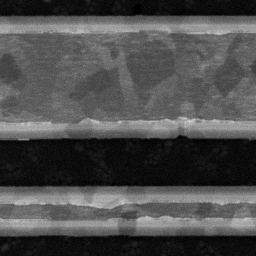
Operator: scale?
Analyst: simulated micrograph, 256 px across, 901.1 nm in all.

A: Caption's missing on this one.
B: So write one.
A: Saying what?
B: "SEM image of one or a few lines or trenches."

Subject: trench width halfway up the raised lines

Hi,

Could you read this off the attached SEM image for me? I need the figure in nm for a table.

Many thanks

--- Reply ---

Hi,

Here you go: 248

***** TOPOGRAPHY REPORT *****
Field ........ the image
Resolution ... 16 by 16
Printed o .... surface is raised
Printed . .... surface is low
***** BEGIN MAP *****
................
................
oooooooooooooooo
oooooooooooooooo
oooooooooooooooo
oooooooooooooooo
oooooooooooooooo
oooooooooooooooo
................
................
................
................
oooooooooooooooo
oooooooooooooooo
................
................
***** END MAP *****